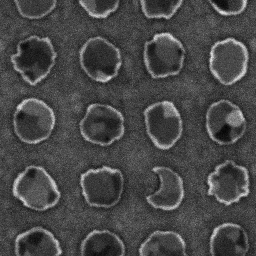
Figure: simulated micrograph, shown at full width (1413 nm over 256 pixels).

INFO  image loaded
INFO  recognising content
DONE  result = a regular array of raised bodies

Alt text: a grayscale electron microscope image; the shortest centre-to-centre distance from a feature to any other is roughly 342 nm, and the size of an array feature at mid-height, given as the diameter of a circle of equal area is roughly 228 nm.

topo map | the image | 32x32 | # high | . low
..#####...#####...####....#####.
..####.....###....####......##..
................................
................................
....................#...........
..####.....###....#####....###..
..#####...#####...#####...#####.
.######...#####...#####...#####.
..####....#####...#####...#####.
...###.....###.....#.......###..
............................#...
................................
...##...........................
..####.....###.....###....####..
..#####....####...####....####..
..#####...#####...#####...#####.
..####....#####....####...####..
...##......###.....###.....###..
................................
................................
............................#...
...###.....####.....##.....####.
..####....#####.....###...#####.
..#####...#####.....###...#####.
..#####....####....####....###..
...####....###.....###..........
................................
................................
...........................###..
...####....####....###.....####.
..#####...#####...#####...#####.
..#####...#####...#####...#####.